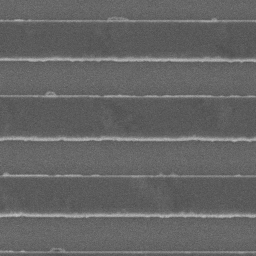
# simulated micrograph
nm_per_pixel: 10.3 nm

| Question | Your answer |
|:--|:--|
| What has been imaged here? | lines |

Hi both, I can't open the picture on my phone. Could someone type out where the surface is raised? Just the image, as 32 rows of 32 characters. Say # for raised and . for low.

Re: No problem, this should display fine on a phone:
................................
................................
................................
################################
################################
################################
################################
################################
................................
................................
................................
................................
################################
################################
################################
################################
################################
....#######.#...#######..#######
................................
................................
................................
................................
################################
################################
################################
################################
################################
................................
................................
................................
................................
###.............................